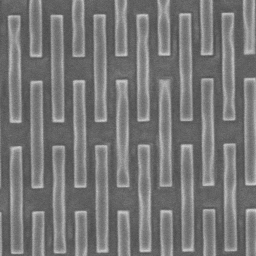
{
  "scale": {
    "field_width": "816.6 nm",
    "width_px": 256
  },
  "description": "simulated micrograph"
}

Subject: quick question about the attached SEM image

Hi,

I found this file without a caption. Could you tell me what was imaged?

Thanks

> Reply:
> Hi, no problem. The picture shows groups of lines, slits or small figures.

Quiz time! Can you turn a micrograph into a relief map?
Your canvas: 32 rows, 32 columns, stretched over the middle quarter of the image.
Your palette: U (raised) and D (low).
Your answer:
DDDDDDDDUUDDDDDDDDDUUDDDDDDDDUUU
DDDDDDDDUUDDDDDDDDDUUDDDDDDDDUUU
DDDDDDDDUUDDDDDDDDUUUDDDDDDDDUUU
DDDDDDDDUUDDDDDDDDUUUDDDDDDDDUUU
DDDUUDDDUUDDDUUDDDDUUDDDDUDDDUUU
DDDUUDDDUUDDDUUDDDDUUDDDUUDDDUUU
DDDUUDDDUUDDDDUDDDDUUDDDUUDDDUUU
DDDUUDDDUUDDDDUDDDUUUDDDUUDDDUUU
DDDUUDDDUUDDDDUUDDUUUDDDUUDDDUUU
DDDUUDDDUUDDDDUUDDUUUDDDUUDDDUUU
DDDUUDDDUUDDDDUUDDUUUDDDUUDDDUUU
DDDUUDDDUUDDDDUUDDUUUDDDUUDDDUUU
DDDUUDDDUUDDDUUUDDUUUDDDUUDDDUUU
DDDUUDDDUUDDDUUUDDDUUDDDUUUDDUUU
DDDUUDDDDDDDDUUUDDDDDDDDUUUDDDDD
DDDUUDDDDDDDDUUUDDDDDDDDUUUDDDDD
DDDUUDDDDDDDDUUUDDDDDDDDUUUDDDDD
DDDUUDDDDDDDDUUUDDDDDDDDUUUDDDDD
DDDUUDDDDDDDDUUUDDDDDDDDUUUDDDDD
DDDUUDDDDDDDDDUUDDDDDDDDUUUDDDDD
DDDUUDDDUUDDDDUUDDDUUDDDUUDDDDUU
DDDUUDDDUUUDDDUUDDDUUDDDUUDDDDUU
DDDUUDDDUUUDDDUUDDDUUDDDUUDDDDUU
DDDUUDDDUUUDDDUUDDDUUDDDUUDDDUUU
DDDUUDDDUUUDDDUUDDDUUDDDUUUDDUUU
DDDUUDDDUUUDDDUUDDDUUDDDUUUDDUUU
DDDUUDDDUUUDDDUUDDDUUDDDUUUDDUUU
DDDUUDDDUUUDDUUUDDDUUDDDUUUDDUUU
DDDUUDDDUUUDDUUUDDDUUDDDUUUDDUUU
DDDUUDDDUUUDDUUUDDDUUDDDUUUDDUUU
DDDUUDDDUUUDDUUUDDDUUDDDDDDDDDUU
DDDDDDDDUUUDDDDDDDDUUDDDDDDDDDUU